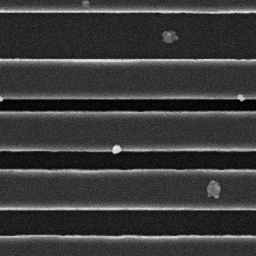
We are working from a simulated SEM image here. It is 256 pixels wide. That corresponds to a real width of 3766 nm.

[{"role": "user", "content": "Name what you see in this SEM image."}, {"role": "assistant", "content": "lines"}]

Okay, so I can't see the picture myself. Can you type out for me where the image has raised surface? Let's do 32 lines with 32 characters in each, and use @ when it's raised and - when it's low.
@@@@@@@@@@@@@@@@@@@@@@@@@@@@@@@@
--------------------------------
--------------------------------
--------------------------------
--------------------------------
--------------------------------
--------------------------------
@@@@@-@------------------@@-----
@@@@@@@@@@@@@@@@@@@@@@@@@@@@@@@@
@@@@@@@@@@@@@@@@@@@@@@@@@@@@@@@@
@@@@@@@@@@@@@@@@@@@@@@@@@@@@@@@@
@@@@@@@@@@@@@@@@@@@@@@@@@@@@@@@@
--------------------------------
--------------------------------
@@@@@@@@@@@@@@@@@@@@@@@@@@@@@@@@
@@@@@@@@@@@@@@@@@@@@@@@@@@@@@@@@
@@@@@@@@@@@@@@@@@@@@@@@@@@@@@@@@
@@@@@@@@@@@@@@@@@@@@@@@@@@@@@@@@
@@@@@@@@@@@@@@@@@@@@@@@@@@@@@@@@
--------------------------------
--------------------------------
@@@@@@@@@@@@@@@@@@@@@@@@@@@@@@@@
@@@@@@@@@@@@@@@@@@@@@@@@@@@@@@@@
@@@@@@@@@@@@@@@@@@@@@@@@@@@@@@@@
@@@@@@@@@@@@@@@@@@@@@@@@@@@@@@@@
@@@@@@@@@@@@@@@@@@@@@@@@@@@@@@@@
--------------------------------
--------------------------------
--------------------------------
--------------------------------
@@@@@@@@@@@@@@@@@@@@@@@@@@@@@@@@
@@@@@@@@@@@@@@@@@@@@@@@@@@@@@@@@